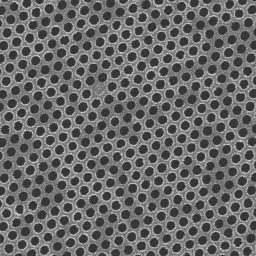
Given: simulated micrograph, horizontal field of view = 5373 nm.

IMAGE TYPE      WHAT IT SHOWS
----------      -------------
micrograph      a regular array of holes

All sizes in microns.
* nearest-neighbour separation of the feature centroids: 0.276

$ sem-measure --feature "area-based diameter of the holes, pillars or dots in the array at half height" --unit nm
200